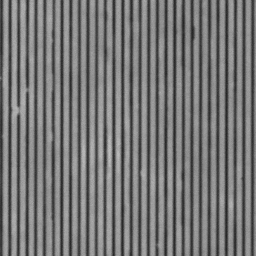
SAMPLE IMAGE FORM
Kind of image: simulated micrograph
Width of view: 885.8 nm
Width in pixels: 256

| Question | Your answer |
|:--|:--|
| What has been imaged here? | parallel lines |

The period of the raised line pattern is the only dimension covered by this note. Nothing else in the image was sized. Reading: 29.9 nm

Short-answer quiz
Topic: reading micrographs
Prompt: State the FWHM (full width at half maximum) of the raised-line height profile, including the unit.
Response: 0.0203 micrometres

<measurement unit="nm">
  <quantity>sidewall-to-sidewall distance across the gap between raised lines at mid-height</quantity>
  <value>10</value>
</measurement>